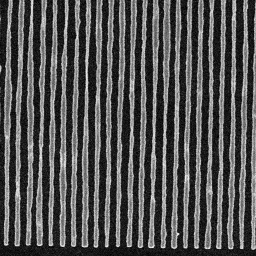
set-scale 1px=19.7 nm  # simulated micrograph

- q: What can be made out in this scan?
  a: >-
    parallel lines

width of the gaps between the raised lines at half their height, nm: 135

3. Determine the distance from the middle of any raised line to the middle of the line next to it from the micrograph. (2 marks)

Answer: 221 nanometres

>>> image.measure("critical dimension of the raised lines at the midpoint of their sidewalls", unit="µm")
0.0885